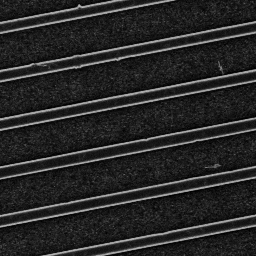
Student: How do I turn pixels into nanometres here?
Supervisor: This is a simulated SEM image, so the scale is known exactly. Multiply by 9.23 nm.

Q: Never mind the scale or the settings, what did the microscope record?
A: parallel lines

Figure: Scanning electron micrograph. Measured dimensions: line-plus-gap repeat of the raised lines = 0.438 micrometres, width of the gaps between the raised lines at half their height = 332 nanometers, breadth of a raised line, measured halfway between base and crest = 101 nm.